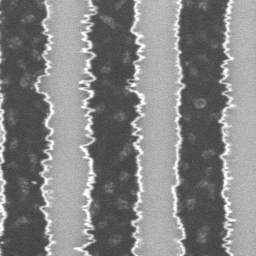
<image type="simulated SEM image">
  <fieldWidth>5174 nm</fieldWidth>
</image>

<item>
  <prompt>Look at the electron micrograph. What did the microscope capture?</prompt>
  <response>one or a few lines or trenches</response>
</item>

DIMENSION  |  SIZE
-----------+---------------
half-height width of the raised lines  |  980 nm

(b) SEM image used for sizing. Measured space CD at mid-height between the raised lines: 817 nm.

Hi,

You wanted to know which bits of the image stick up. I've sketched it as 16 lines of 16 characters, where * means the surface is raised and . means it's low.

***...***..***..
***..***...***..
***..****..***..
***...***..***..
***...***..***..
***..***...***..
***..****..***..
***...***..***..
***...***..***..
***..****..***..
***...***..***..
***...***..***..
***..****..***..
***..****..***..
***..****..***..
***..****..***..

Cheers